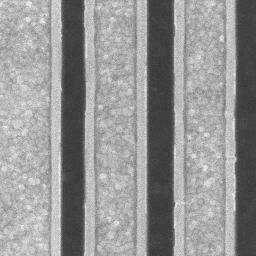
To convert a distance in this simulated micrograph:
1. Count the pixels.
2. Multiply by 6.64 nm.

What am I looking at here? one or a few lines or trenches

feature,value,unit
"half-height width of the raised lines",0.243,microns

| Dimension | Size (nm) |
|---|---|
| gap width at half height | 341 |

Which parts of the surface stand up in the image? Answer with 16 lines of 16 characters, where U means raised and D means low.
DDDDUUDDDUUDDDUU
DDDDUUDDDUUDDDUU
DDDDUUDDDUUDDDUU
DDDDUUDDDUUDDDUU
DDDDUUDDDUUDDDUU
DDDDUUDDDUUDDDUU
DDDDUUDDDUUDDDUU
DDDUUUDDDUUDDDUU
DDDUUUDDDUUDDDUU
DDDDUUDDDUUDDDUU
DDDDUUDDDUUDDDUU
DDDDUUDDDUUDDDUU
DDDDUUDDDUUDDDUU
DDDUUUDDDUUDDDUU
DDDUUUDDDUUDDDUU
DDDUUUDDDUUDDDUU